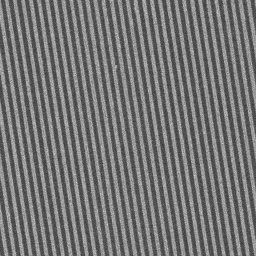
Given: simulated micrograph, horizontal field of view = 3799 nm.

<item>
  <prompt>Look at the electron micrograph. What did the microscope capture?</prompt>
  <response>parallel lines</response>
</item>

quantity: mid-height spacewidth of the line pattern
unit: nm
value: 66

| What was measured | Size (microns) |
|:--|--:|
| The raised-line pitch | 0.118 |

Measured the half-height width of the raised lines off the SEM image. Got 53.1 nm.